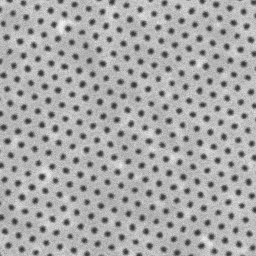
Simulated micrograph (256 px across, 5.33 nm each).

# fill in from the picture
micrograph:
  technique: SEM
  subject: a regular array of holes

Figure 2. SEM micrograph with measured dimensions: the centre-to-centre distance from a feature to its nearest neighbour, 74.3 nanometers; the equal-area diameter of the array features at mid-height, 35.1 nanometres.